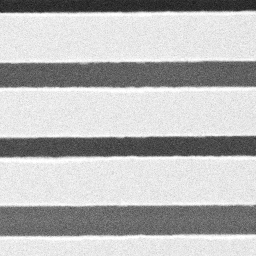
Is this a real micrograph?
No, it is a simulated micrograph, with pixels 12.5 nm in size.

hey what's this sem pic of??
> lines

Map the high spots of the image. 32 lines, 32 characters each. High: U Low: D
DDDDDDDDDDDDDDDDDDDDDDDDDDDDDDDD
DDDDDDDDDDDDDDDDDUDDUUDUUUUUUUUU
UUUUUUUUUUUUUUUUUUUUUUUUUUUUUUUU
UUUUUUUUUUUUUUUUUUUUUUUUUUUUUUUU
UUUUUUUUUUUUUUUUUUUUUUUUUUUUUUUU
UUUUUUUUUUUUUUUUUUUUUUUUUUUUUUUU
UUUUUUUUUUUUUUUUUUUUUUUUUUUUUUUU
UUUUUUUUUUUUUUUUUUUUUUUUUUDUUUUU
DDDDDDDDDDDDDDDDDDDDDDDDDDDDDDDD
DDDDDDDDDDDDDDDDDDDDDDDDDDDDDDDD
DDDDDDDDDDDDDDDDDDDDDDDDDDDDDDDD
UUUUUUUUUUUUUUUUUUUUUUUUUUUUUUUU
UUUUUUUUUUUUUUUUUUUUUUUUUUUUUUUU
UUUUUUUUUUUUUUUUUUUUUUUUUUUUUUUU
UUUUUUUUUUUUUUUUUUUUUUUUUUUUUUUU
UUUUUUUUUUUUUUUUUUUUUUUUUUUUUUUU
UUUUUUUUUUUUUUUUUUUUUUUUUUUUUUUU
DDDDDDDDDDDDDDDDDDDDDDDDDDDDDDDD
DDDDDDDDDDDDDDDDDDDDDDDDDDDDDDDD
DDDDDDDDDDDDDDDDDDDDDDDDDDDDDDDD
UUUUUUUUUUUUUUUUUUUUUUUUUUUUUUUU
UUUUUUUUUUUUUUUUUUUUUUUUUUUUUUUU
UUUUUUUUUUUUUUUUUUUUUUUUUUUUUUUU
UUUUUUUUUUUUUUUUUUUUUUUUUUUUUUUU
UUUUUUUUUUUUUUUUUUUUUUUUUUUUUUUU
UUUUUUUUUUUUUUUUUUUUUUUUUUUUUUUU
DDDDDDDDDDDDDDDDDDDDDDDDDDDDDDDD
DDDDDDDDDDDDDDDDDDDDDDDDDDDDDDDD
DDDDDDDDDDDDDDDDDDDDDDDDDDDDDDDD
DDDDDDDDDDUDUDDUUUUUUUUUUUUUUUUU
UUUUUUUUUUUUUUUUUUUUUUUUUUUUUUUU
UUUUUUUUUUUUUUUUUUUUUUUUUUUUUUUU